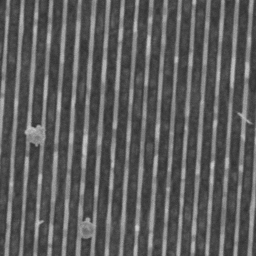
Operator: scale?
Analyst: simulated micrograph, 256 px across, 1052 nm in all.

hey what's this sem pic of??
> parallel lines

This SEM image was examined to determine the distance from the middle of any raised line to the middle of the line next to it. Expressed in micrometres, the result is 0.0586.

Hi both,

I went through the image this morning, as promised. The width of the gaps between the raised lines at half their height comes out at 11.2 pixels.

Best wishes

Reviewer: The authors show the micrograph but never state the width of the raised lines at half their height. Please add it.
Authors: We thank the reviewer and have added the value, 13.8 nm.